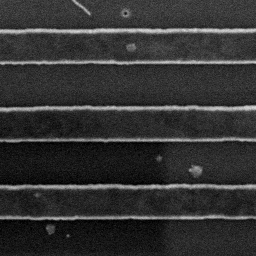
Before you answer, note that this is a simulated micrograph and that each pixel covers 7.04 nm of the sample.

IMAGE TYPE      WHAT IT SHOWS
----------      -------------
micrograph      lines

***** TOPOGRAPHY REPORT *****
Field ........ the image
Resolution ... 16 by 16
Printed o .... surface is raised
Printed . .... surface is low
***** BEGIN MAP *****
................
................
oooooooooooooooo
oooooooooooooooo
................
................
................
oooooooooooooooo
oooooooooooooooo
................
................
................
oooooooooooooooo
oooooooooooooooo
................
................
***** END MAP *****